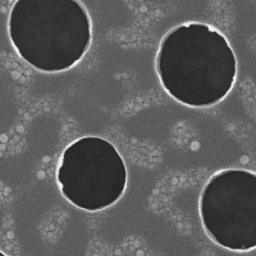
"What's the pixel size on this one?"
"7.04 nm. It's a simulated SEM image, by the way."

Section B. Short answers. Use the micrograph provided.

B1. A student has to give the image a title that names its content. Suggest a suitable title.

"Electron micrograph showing holes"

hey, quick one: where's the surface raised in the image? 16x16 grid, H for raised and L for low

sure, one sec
HLLLLHHHHHHHHHHH
HLLLLLHHHHHHHHHH
HLLLLLHHHHLLLLHH
HLLLLHHHHHLLLLLH
HHHHHHHHHHLLLLLH
HHHHHHHHHHLLLLHH
HHHHHHHHHHHHLHHH
HHHHHHHHHHHHHHHH
HHHHHHHHHHHHHHHH
HHHHLLLHHHHHHHHH
HHHHLLLLHHHHHHHH
HHHHLLLLHHHHHLLL
HHHHLLLHHHHHHLLL
HHHHHHHHHHHHHLLL
HHHHHHHHHHHHHLLL
HHHHHHHHHHHHHHLL